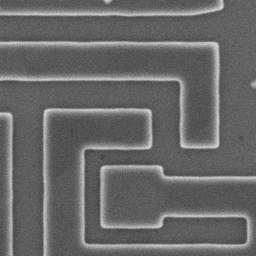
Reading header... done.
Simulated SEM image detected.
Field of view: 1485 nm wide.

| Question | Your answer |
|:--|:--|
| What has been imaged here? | wiring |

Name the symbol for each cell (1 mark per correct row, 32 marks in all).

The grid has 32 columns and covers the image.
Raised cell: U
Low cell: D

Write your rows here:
UUUUUUUUUUUUUUUUUUUUUUUUUUUUDDDD
UUUUUUUUUUUUUUUUUUUUUUUUUUDDDDDD
DDDDDDDDDDDDDDDDDDDDDDDDDDDDDDDD
DDDDDDDDDDDDDDDDDDDDDDDDDDDDDDDD
DDDDDDDDDDDDDDDDDDDDDDDDDDDDDDDD
UUUUUUUUUUUUUUUUUUUUUUUUUUUDDDDD
UUUUUUUUUUUUUUUUUUUUUUUUUUUDDDDD
UUUUUUUUUUUUUUUUUUUUUUUUUUUDDDDD
UUUUUUUUUUUUUUUUUUUUUUUUUUUDDDDD
UUUUUUUUUUUUUUUUUUUUUUUUUUUDDDDD
DDDDDDDDDDDDDDDDDDDDDDUUUUUDDDDD
DDDDDDDDDDDDDDDDDDDDDDDUUUUDDDDD
DDDDDDDDDDDDDDDDDDDDDDDUUUUDDDDD
DDDDDDDDDDDDDDDDDDDDDDDUUUUDDDDD
UDDDDDUUUUUUUUUUUUUDDDDUUUUDDDDD
UDDDDUUUUUUUUUUUUUUDDDDUUUUDDDDD
UDDDDUUUUUUUUUUUUUUDDDDUUUUDDDDD
UDDDDUUUUUUUUUUUUUUDDDDUUUUDDDDD
UDDDDUUUUUUUUUUUUUUDDDDDDDDDDDDD
UDDDDDUUUUDDDDDDDDDDDDDDDDDDDDDD
UDDDDUUUUUUDDDDDDDDDDDDDDDDDDDDD
UDDDDUUUUUDDDUUUUUUUDDDDDDDDDDDD
UDDDDDUUUUDDDUUUUUUUUUUUUUUUUUUU
UDDDDDUUUUDDDUUUUUUUUUUUUUUUUUUU
UDDDDDUUUUDDDUUUUUUUUUUUUUUUUUUU
UDDDDDUUUUDDDUUUUUUUUUUUUUUUUUUU
UDDDDUUUUUDDDUUUUUUUUUUUUUUUUUUU
UDDDDUUUUUUDDUUUUUUUDDDDDDDDDDDU
UDDDDDUUUUUDDUUUUUUUDDDDDDDDDDDU
UDDDDDUUUUUDDDDDDDDDDDDDDDDDDDDU
UDDDDDUUUUUDDDDDDDDDDDDDDDDDDDUU
UDDDDDUUUUUUUUUUUUUUUUUUUUUUUUUU